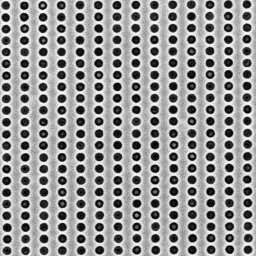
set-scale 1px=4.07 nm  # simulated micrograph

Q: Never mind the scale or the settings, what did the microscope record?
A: a regular array of holes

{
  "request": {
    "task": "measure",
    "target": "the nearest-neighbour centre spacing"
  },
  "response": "47 nanometers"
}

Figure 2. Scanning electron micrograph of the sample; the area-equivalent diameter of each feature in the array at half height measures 37.3 nanometres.